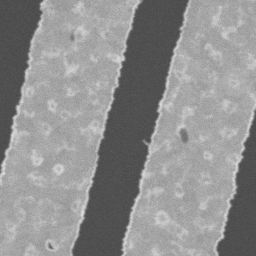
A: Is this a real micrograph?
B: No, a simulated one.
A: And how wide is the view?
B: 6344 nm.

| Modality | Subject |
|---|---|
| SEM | one or a few lines or trenches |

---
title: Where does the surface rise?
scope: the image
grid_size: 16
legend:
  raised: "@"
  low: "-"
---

---@@@@@----@@@@
---@@@@@---@@@@@
--@@@@@@---@@@@@
--@@@@@@---@@@@@
--@@@@@----@@@@@
-@@@@@@---@@@@@@
-@@@@@@---@@@@@@
-@@@@@@---@@@@@@
-@@@@@----@@@@@-
-@@@@@---@@@@@@-
@@@@@@---@@@@@@-
@@@@@@---@@@@@@-
@@@@@----@@@@@--
@@@@@---@@@@@@--
@@@@@---@@@@@@--
@@@@@---@@@@@@--